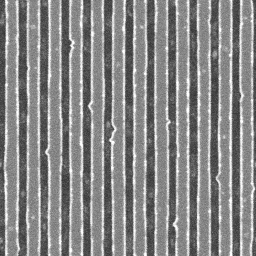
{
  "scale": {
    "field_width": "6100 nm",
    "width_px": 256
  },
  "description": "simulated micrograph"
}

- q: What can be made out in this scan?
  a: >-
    parallel lines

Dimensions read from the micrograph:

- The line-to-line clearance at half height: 206 nanometers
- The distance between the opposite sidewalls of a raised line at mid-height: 292 nanometers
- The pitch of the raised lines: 508 nm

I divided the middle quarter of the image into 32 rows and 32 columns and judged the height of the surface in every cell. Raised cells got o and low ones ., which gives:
..oo...ooo..ooo...ooo..ooo..ooo.
..oo...ooo..ooo..ooo...ooo..ooo.
..oo...ooo..ooo..ooo...ooo..ooo.
..oo...ooo..ooo..ooo...ooo..ooo.
..oo...ooo..ooo..ooo...ooo..ooo.
..oo...ooo..ooo..ooo...ooo..ooo.
..oo...ooo..ooo..ooo...ooo..ooo.
..oo...ooo..ooo...oo...ooo..ooo.
..oo...ooo..ooo...oo...ooo..ooo.
..ooo..ooo..ooo...oo...ooo..ooo.
..ooo.oooo..ooo...oo...ooo..ooo.
..ooo..ooo..ooo...oo...ooo..ooo.
..ooo..ooo..ooo...oo...ooo..ooo.
..ooo..ooo..ooo...oo...ooo..ooo.
..oo...ooo..ooo...oo...ooo..ooo.
..oo...ooo..ooo...oo...ooo..ooo.
..oo...ooo...oo...oo...ooo..ooo.
..oo...ooo..ooo...oo...ooo..ooo.
..oo...ooo..ooo...oo...ooo..ooo.
..ooo..ooo..ooo...oo...ooo..ooo.
..ooo..ooo..ooo..ooo...ooo..ooo.
..ooo..ooo..ooo..ooo...ooo..ooo.
..ooo..ooo..ooo..ooo...ooo..ooo.
..ooo..ooo..ooo..ooo...ooo..ooo.
..ooo..ooo..ooo..ooo...ooo..ooo.
..ooo..ooo..ooo..ooo...ooo..ooo.
..ooo..ooo..ooo..ooo...ooo..ooo.
..ooo..ooo..ooo..ooo...ooo..ooo.
..oo...ooo..ooo..ooo...ooo..ooo.
..ooo..ooo..ooo..ooo...ooo..ooo.
..ooo..ooo..ooo..ooo...ooo..ooo.
..oo...ooo..ooo..ooo...ooo..ooo.